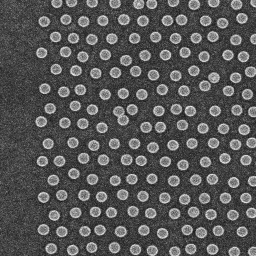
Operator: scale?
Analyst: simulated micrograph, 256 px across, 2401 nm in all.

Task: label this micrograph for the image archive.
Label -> a regular array of raised bodies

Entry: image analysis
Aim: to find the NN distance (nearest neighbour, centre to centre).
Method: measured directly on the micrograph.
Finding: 163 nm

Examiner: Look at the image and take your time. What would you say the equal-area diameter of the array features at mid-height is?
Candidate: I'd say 94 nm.